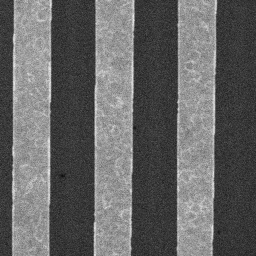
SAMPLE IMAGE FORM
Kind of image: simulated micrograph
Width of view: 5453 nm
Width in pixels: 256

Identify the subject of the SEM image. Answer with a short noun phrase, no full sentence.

lines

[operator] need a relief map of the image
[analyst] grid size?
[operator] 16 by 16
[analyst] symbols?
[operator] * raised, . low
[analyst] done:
.**...**...***..
.**...**...**...
.**...**...**...
.**...**...**...
.**...**...**...
.**...**...**...
.**...**...**...
.**...**...**...
.**...**...**...
.**...**...**...
.**...**...**...
.**...**...**...
.**...**...**...
.**...**...**...
.**...**...**...
.**...**...**...